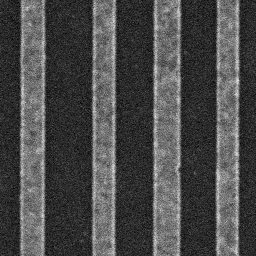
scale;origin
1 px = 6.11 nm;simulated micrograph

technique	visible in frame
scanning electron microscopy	one or a few lines or trenches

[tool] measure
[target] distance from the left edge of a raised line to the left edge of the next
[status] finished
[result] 397 nanometers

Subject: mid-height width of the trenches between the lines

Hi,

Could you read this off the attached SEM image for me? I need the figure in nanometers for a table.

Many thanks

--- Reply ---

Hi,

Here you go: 251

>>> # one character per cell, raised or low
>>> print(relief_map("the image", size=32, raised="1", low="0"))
00011000000011000001110000011100
00011000000011000001110000011100
00011000000011000001110000011100
00011000000011000001110000011100
00011000000011000001110000011100
00011000000011000001110000011100
00011000000011000001110000011100
00011100000011000001110000011100
00011000000011000001110000011100
00011000000011000001110000011100
00011000000011000001110000011100
00011000000011000001110000011100
00011000000011000001110000011100
00011000000011000001110000011100
00011000000011000001110000011100
00011000000011000001110000011100
00011000000011000001110000011100
00011000000011000001110000011100
00011000000011000001110000011100
00011000000011000001110000011100
00011000000011000001110000011100
00011000000011000001110000011100
00011000000011000001110000011100
00011000000011000001110000011100
00011000000011000001110000011100
00011000000011000001110000011100
00011000000011000001110000011100
00011000000011000001110000011100
00011000000011000001110000011100
00011000000011000001110000011100
00011000000011000001110000011100
00011000000011000001110000011100